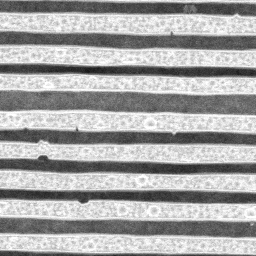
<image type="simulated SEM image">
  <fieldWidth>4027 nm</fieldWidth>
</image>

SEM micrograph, parallel lines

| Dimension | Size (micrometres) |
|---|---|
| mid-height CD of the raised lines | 0.266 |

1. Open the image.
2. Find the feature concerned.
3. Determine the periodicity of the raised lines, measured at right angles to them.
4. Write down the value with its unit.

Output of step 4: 496 nm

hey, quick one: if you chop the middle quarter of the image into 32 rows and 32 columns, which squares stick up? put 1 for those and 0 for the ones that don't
00000000000000000000000111111000
00000000000000000000000000000000
00000000000000000000000000000000
11111111111111111111111111111111
11111111111111111111111111111111
11111111111111111111111111111111
01110000111111111111111111111111
00000000000000000000000000000000
00000000000000000000000000000000
00000000000000000000000000000000
00000000000000000000000000000000
00000000000000000000000000000000
11111111111111111000000011110000
11111111111111111111111111111111
11111111111111111111111111111111
11111111111111111111111111111111
00000111111110000011111111111111
00000000000000000000000000000000
00000000000000000000000000000000
00000000000000000000000000000000
11111111111111111111111111110011
11111111111111111111111111111111
11111111111111111111111111111111
11111111111111111111111111111111
00000000000000000000000001111111
00000000000000000000000000000000
00000000000000000000000000000000
00010001110111110000000000000000
11111111111111111111111111111111
11111111111111111111111111111111
11111111111111111111111111111111
00000111100000000000000000000000